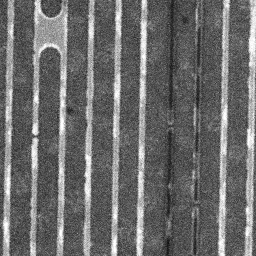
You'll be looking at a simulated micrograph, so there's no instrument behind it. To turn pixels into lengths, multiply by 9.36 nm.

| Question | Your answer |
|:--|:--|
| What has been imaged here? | parallel lines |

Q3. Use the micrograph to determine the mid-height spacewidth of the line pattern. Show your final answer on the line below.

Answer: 207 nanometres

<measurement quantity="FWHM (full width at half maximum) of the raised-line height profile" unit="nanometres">49.1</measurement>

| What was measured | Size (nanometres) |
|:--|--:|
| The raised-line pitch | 252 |